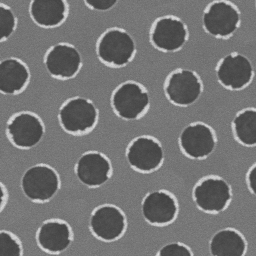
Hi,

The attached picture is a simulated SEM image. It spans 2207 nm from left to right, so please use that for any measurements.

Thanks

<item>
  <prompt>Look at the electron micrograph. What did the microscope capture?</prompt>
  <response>a regular array of holes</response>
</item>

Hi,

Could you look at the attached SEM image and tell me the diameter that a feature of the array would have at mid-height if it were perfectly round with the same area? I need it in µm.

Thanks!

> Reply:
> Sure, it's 0.283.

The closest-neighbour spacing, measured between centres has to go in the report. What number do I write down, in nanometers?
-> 466